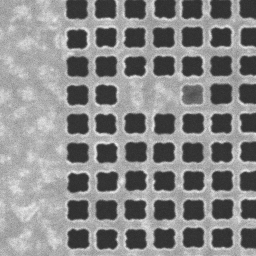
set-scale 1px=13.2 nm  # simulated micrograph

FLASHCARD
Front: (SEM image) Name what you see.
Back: a regular array of holes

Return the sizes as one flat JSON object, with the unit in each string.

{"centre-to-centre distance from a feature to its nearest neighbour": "0.372 um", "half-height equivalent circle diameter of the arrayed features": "303 nanometres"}